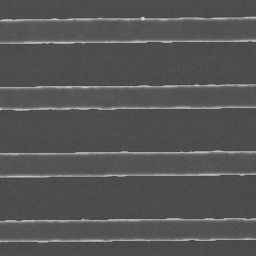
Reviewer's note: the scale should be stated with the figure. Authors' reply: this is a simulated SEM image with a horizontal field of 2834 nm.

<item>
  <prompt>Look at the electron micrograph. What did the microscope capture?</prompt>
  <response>lines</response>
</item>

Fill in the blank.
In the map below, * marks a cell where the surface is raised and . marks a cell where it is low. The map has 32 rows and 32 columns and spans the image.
................................
................................
********************************
********************************
********************************
................................
................................
................................
................................
................................
................................
********************************
********************************
****************************....
................................
................................
................................
................................
................................
********************************
********************************
********************************
................................
................................
................................
................................
................................
..........*..*******************
********************************
********************************
................................
................................